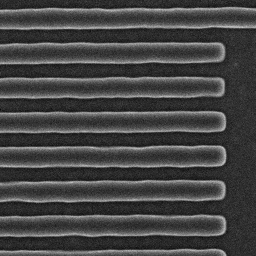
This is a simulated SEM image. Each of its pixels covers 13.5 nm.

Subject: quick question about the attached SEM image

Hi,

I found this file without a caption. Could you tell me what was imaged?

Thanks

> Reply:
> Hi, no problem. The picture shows groups of lines, slits or small figures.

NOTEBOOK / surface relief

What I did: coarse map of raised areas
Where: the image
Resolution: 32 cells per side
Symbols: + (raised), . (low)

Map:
................................
++++++++++++++++++++++++++++++++
++++++++++++++++++++++++++++++++
++++++++.++.....................
................................
....++++++++++++++++++++++++....
++++++++++++++++++++++++++++....
++++++++++++++++++++++++++++....
................................
................................
++++++++++++++++++++++++++++....
++++++++++++++++++++++++++++....
................................
................................
++++++++++++++++++++++++++++....
++++++++++++++++++++++++++++....
...++..++.......................
................................
+++++++++++++.++++++++++++++....
++++++++++++++++++++++++++++....
++++++++++++++++++++++++++++....
................................
................................
++++++++++++++++++++++++++++....
++++++++++++++++++++++++++++....
................................
................................
++++++++++++++++++++++++++++....
++++++++++++++++++++++++++++....
..+.............................
................................
++++++++...+++++++++++++++++....